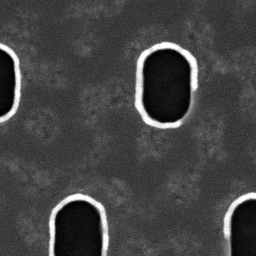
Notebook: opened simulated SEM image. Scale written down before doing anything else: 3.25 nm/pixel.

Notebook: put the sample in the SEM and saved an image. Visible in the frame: holes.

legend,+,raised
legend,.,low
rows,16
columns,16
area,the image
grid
++++++++++++++++
++++++++++++++++
++++++++++++++++
.++++++++..+++++
.++++++++...++++
.++++++++...++++
.++++++++...++++
++++++++++.+++++
++++++++++++++++
++++++++++++++++
++++++++++++++++
++++++++++++++++
++++++++++++++++
++++..+++++++++.
+++...++++++++..
+++...++++++++..